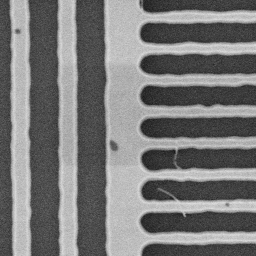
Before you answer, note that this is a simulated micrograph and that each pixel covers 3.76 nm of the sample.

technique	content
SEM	groups of lines, slits or small figures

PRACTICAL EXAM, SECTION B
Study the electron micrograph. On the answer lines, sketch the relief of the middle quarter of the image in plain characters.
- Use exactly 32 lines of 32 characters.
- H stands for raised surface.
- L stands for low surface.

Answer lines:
HHHLLLLLLLLHHHHHHHHLLLLLLLLLLLLL
HHHLLLLLLLLHHHHHHHHLLLLLLLLLLLLL
HHHLLLLLLLLHHHHHHHHHHLLLLLLLLLLL
HHHLLLLLLLLHHHHHHHHHHHHHHHHHHHHH
HHHLLLLLLLLHHHHHHHHHHHHHHHHHHHHH
HHHLLLLLLLLHHHHHHHHHLLLLLLLLLLLL
HHHLLLLLLLLHHHHHHHHLLLLLLLLLLLLL
HHHLLLLLLLLHHHHHHHHLLLLLLLLLLLLL
HHHLLLLLLLHHHHHHHHHLLLLLLLLLLLLL
HHHLLLLLLLHHHHHHHHHLLLLLLLLLLLLL
HHHLLLLLLLLHHHHHHHHHHLLLLLLLLLLL
HHHLLLLLLLLHHHHHHHHHHHHHHHHHHHHH
HHHLLLLLLLLHHHHHHHHHHHHHHHHHHHHH
HHHLLLLLLLLHHHHHHHHHHLLLLLLLLLLL
HHHLLLLLLLLHHHHHHHHLLLLLLLLLLLLL
HHHLLLLLLLLHHHHHHHHLLLLLLLLLLLLL
HHHLLLLLLLLHHHHHHHHLLLLLLLLLLLLL
HHHLLLLLLLLHHHHHHHHLLLLLLLLLLLLL
HHHLLLLLLLLHHHHHHHHHHLLLLLLLLLLL
HHHLLLLLLLLHHHHHHHHHHHHHHHHHHHHH
HHHLLLLLLLLHHHHHHHHHHHHHHHHHHHHH
HHHLLLLLLLLHHHHHHHHHHLLLLLLLLLLL
HHHLLLLLLLLHHHHHHHHLLLLLLLLLLLLL
HHHLLLLLLLLHHHHHHHHLLLLLLLLLLLLL
HHHLLLLLLLLHHHHHHHHLLLLLLLLLLLLL
HHHLLLLLLLLHHHHHHHHHLLLLLLLLLLLL
HHHLLLLLLLLHHHHHHHHHHLLLLLLLLLLL
HHHLLLLLLLLHHHHHHHHHHHHHHHHHHHHH
HHHLLLLLLLLHHHHHHHHHHHHHHHHHHHHH
HHHLLLLLLLLHHHHHHHHHLLLLLLLLLLLL
HHHLLLLLLLLHHHHHHHHLLLLLLLLLLLLL
HHHLLLLLLLLHHHHHHHHLLLLLLLLLLLLL